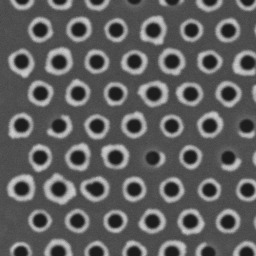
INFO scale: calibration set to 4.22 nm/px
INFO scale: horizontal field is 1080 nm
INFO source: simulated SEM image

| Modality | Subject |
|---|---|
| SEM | a regular array of holes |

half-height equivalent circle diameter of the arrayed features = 58.9 nanometres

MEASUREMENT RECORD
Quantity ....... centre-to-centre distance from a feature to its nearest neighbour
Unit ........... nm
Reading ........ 154